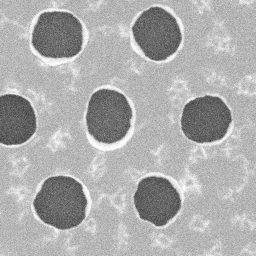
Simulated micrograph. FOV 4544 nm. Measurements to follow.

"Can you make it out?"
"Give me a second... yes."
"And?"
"holes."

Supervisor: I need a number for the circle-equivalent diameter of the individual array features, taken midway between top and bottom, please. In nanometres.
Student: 937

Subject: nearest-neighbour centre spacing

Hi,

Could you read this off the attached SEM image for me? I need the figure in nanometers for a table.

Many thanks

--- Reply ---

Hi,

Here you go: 1700